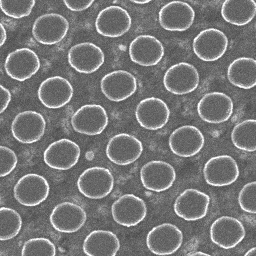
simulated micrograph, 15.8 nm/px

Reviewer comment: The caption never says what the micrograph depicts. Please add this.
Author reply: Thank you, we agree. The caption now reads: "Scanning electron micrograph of a regular array of raised bodies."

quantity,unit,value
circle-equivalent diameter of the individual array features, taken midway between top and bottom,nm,505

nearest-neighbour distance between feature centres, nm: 693